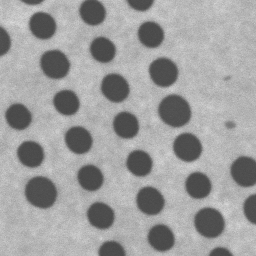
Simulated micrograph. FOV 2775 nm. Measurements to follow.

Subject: a regular array of holes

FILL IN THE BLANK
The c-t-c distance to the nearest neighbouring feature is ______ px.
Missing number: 39.3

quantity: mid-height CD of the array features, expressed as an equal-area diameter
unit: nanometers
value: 297